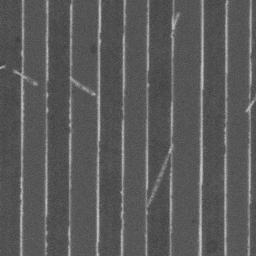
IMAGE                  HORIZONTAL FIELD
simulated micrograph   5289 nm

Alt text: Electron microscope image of lines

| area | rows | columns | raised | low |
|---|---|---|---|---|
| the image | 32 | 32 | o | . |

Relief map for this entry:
...ooo...oooo...ooo...ooo...ooo.
...ooo...oooo...ooo...ooo...ooo.
...ooo...ooo....ooo...ooo...ooo.
...ooo...ooo....ooo...ooo...ooo.
...ooo...ooo...oooo..oooo...ooo.
...ooo...ooo....ooo...ooo...ooo.
...ooo...ooo...ooo....ooo...ooo.
...ooo...ooo...oooo...ooo...ooo.
...ooo...ooo...oooo...ooo...ooo.
...ooo...ooo...ooo....ooo...ooo.
...ooo...ooo...ooo....ooo...ooo.
...ooo...ooo...ooo....ooo...ooo.
...ooo...ooo...ooo....ooo...ooo.
...ooo...ooo...ooo...oooo...ooo.
...ooo...ooo...ooo...oooo...ooo.
...ooo...ooo...ooo...oooo...ooo.
...ooo...ooo...ooo...oooo...ooo.
...ooo...ooo...ooo...oooo...ooo.
...ooo...ooo...ooo...oooo...ooo.
...ooo...ooo...ooo...oooo...ooo.
...ooo...ooo...ooo...oooo...ooo.
...ooo...ooo...ooo...oooo...ooo.
...ooo...ooo...ooo...oooo...ooo.
...ooo...ooo...ooo...oooo...ooo.
...ooo...ooo...ooo...oooo...ooo.
...ooo...ooo...ooo...oooo...ooo.
...ooo...ooo...ooo...oooo...ooo.
...ooo...ooo...ooo...oooo...ooo.
...ooo...ooo...ooo...oooo...ooo.
...ooo...ooo...ooo...oooo...ooo.
...ooo...ooo...ooo...oooo...ooo.
...ooo...ooo...ooo...oooo...ooo.